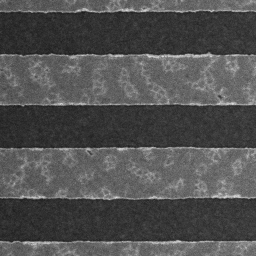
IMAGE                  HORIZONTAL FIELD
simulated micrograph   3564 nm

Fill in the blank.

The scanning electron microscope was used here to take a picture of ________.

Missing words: one or a few lines or trenches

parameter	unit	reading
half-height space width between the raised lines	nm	605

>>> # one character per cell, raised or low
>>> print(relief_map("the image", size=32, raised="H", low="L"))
HHHHHHHHHHHHHHHHHHHHHHHHHHHHHHHH
LLLLLHLHHHLLHLLLLLLLLLHLLLLLLLLL
LLLLLLLLLLLLLLLLLLLLLLLLLLLLLLLL
LLLLLLLLLLLLLLLLLLLLLLLLLLLLLLLL
LLLLLLLLLLLLLLLLLLLLLLLLLLLLLLLL
LLLLLLLLLLLLLLLLLLLLLLLLLLLLLLLL
LLLLLLLLLLLLLLLLLLLLLLLLLLLLLLLL
HHHHHHHHHHHHHHHHHHHHHHHHHHHHHHHH
HHHHHHHHHHHHHHHHHHHHHHHHHHHHHHHH
HHHHHHHHHHHHHHHHHHHHHHHHHHHHHHHH
HHHHHHHHHHHHHHHHHHHHHHHHHHHHHHHH
HHHHHHHHHHHHHHHHHHHHHHHHHHHHHHHH
HHHHHHHHHHHHHHHHHHHHHHHHHHHHHHHH
LLLLLLLLLLLLLLLLLLLLLLLLLLLLLLLL
LLLLLLLLLLLLLLLLLLLLLLLLLLLLLLLL
LLLLLLLLLLLLLLLLLLLLLLLLLLLLLLLL
LLLLLLLLLLLLLLLLLLLLLLLLLLLLLLLL
LLLLLLLLLLLLLLLLLLLLLLLLLLLLLLLL
LLLLLLLLLLLLLHHLLHHLLHHHHLLLLLLL
HHHHHHHHHHHHHHHHHHHHHHHHHHHHHHHH
HHHHHHHHHHHHHHHHHHHHHHHHHHHHHHHH
HHHHHHHHHHHHHHHHHHHHHHHHHHHHHHHH
HHHHHHHHHHHHHHHHHHHHHHHHHHHHHHHH
HHHHHHHHHHHHHHHHHHHHHHHHHHHHHHHH
HHHHHHHHHHHHHHHHHHHHHHHHHHHHHHHH
LLLLLLLLLLLLLLLLLLLLLLLLLLLLLLLL
LLLLLLLLLLLLLLLLLLLLLLLLLLLLLLLL
LLLLLLLLLLLLLLLLLLLLLLLLLLLLLLLL
LLLLLLLLLLLLLLLLLLLLLLLLLLLLLLLL
LLLLLLLLLLLLLLLLLLLLLLLLLLLLLLLL
HHHHHHHHHHHHHHHHHHHHHHHHHHHHHHHH
HHHHHHHHHHHHHHHHHHHHHHHHHHHHHHHH